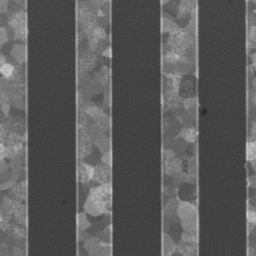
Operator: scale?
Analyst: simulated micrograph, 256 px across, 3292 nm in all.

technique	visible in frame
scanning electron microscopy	one or a few lines or trenches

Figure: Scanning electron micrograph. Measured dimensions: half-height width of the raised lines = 453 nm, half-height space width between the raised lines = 640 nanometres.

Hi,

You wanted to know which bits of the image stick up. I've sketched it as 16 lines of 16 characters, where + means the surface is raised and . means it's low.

++...++...++...+
++...++...++...+
++...++...++...+
++...++...++...+
++...++...++...+
++...++...++...+
++...++...++...+
++...++...++...+
++...++...++...+
++...++...++...+
++...++...++...+
++...++...++...+
++...++...++...+
++...++...++...+
++...++...++...+
++...++...++...+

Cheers